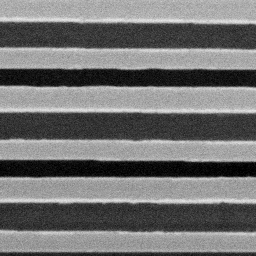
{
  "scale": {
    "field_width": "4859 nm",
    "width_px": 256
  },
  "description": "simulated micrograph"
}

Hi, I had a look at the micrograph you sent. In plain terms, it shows lines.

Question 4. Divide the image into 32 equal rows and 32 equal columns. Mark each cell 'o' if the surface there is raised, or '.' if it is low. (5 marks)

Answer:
oooooooooooooooooooooooooooooooo
oooooooooooooooooooooooooooooooo
oooooooooooooooooooooooooooooooo
................................
................................
................................
oooooooooooooooooooooooooooooooo
oooooooooooooooooooooooooooooooo
........ooo...ooooo.oooooooooooo
................................
................................
oooooooooooooooooooooooooooooooo
oooooooooooooooooooooooooooooooo
oooooooooooooooooooooooooooooooo
................................
................................
................................
................................
oooooooooooooooooooooooooooooooo
oooooooooooooooooooooooooooooooo
................................
................................
oooooooooooooooooooooooooooooooo
oooooooooooooooooooooooooooooooo
oooooooooooooooooooooooooooooooo
................................
................................
................................
................................
oooooooooooooooooooooooooooooooo
oooooooooooooooooooooooooooooooo
................................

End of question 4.